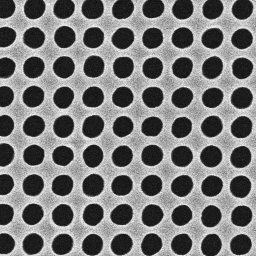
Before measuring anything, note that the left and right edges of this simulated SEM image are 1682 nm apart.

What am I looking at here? a regular array of holes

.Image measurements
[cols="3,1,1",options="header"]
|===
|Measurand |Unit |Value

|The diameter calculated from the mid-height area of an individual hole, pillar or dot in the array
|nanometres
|141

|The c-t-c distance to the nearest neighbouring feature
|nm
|191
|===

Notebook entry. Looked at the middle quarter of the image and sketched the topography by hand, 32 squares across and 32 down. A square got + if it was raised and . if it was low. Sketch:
...++.....++......++.....++.....
...++.....++.....+++.....++.....
..+++....++++....+++....+++.....
.++++++.++++++.++++++..++++++..+
++++++++++++++++++++++++++++++++
++++++++++++++++++++++++++++++++
..+++.....+++....+++....++++....
..+++.....++.....+++.....++.....
..++......++......+......++.....
..+++.....++.....+++....+++.....
.+++++...++++...+++++...++++...+
++++++++++++++++++++++++++++++++
++++++++++++++++++++++++++++++++
..++++...++++...+++++...++++...+
..+++.....+++....+++.....++.....
...++.....++.....++......++.....
..++......++.....++......++.....
..+++....++++...++++....+++....+
++++++++++++++++++++++++++++..++
++++++++++++++++++++++++++++++++
++++++...+++++..+++++..++++++.++
..+++....++++....+++....+++.....
..+++.....++.....++......++.....
..+++.....++.....++......++.....
..+++....+++.....+++....+++.....
++++++..+++++...+++++.++++++..++
++++++++++++++++++++++++++++++++
+++++++.++++++++++++++++++++++++
..+++....++++...++++....++++....
..+++.....++.....++.....+++.....
..+++.....++.....++......++.....
..+++.....++.....++.....+++.....